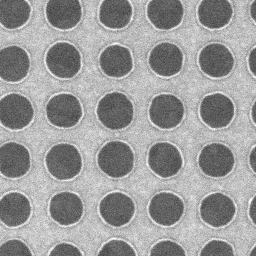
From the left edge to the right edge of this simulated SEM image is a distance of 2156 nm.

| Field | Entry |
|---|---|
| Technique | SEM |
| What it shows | a regular array of raised bodies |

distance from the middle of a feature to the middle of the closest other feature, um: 0.415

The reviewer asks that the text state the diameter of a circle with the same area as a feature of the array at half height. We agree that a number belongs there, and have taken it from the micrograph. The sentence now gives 314 nm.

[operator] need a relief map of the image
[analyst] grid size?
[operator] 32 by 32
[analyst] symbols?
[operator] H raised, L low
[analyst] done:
HHHHLLHHHHLLLHHHLLHHHHHLLHHHHLLH
HHHHLLHHHHLLHHHHHLHHHHHLLHHHHLLH
HHHHLLHHHHLLHHHHLLLHHHHLLHHHHLLL
LHLLLLLHHLLLLHHHLLLHHHLLLLHHLLLL
LLLLLLLLLLLLLLLLLLLLLLLLLLLLLLLL
LLLLLLLHHLLLLLHLLLLLHHLLLLHHLLLL
HHHLLLHHHHLLLHHHLLLHHHHLLHHHHLLH
HHHHLLHHHHLLHHHHHLHHHHHLLHHHHLLH
HHHHLLHHHHLLLHHHHLLHHHHLLHHHHLLH
HHHLLLLHHLLLLHHHLLLLHHLLLLHHLLLL
LLLLLLLLLLLLLLLLLLLLLLLLLLLLLLLL
LLLLLLLLLLLLLLHLLLLLLLLLLLLLLLLL
HHHHLLHHHHLLHHHHLLLHHHHLLHHHHLLL
HHHHLLHHHHLLHHHHHLLHHHHLLHHHHLLH
HHHHLLHHHHLLHHHHHLLHHHHLLHHHHLLH
HHHHLLHHHHLLLHHHLLLHHHLLLLHHHLLL
LLLLLLLLLLLLLLLLLLLLLLLLLLLLLLLL
LLLLLLLLLLLLLLLLLLLLLLLLLLLLLLLL
HHHLLLHHHHLLLHHHLLLHHHLLLHHHHLLL
HHHHLLHHHHLLHHHHHLHHHHHLLHHHHLLH
HHHHLLHHHHLLHHHHHLHHHHHLLHHHHLLH
HHHHLLHHHHLLLHHHLLLHHHLLLHHHHLLL
LLLLLLLHHLLLLLLLLLLLLLLLLLLLLLLL
LLLLLLLLLLLLLLLLLLLLLLLLLLLLLLLL
HHHLLLLHHHLLLHHHLLLHHHLLLLHHHLLL
HHHHLLHHHHLLHHHHHLLHHHHLLHHHHLLH
HHHHLLHHHHLLHHHHHLHHHHHLLHHHHHLH
HHHHLLLHHHLLLHHHLLLHHHHLLHHHHLLH
LLLLLLLLLLLLLLLLLLLLLLLLLLLHLLLL
LLLLLLLLLLLLLLLLLLLLLLLLLLLLLLLL
HHHLLLLHHLLLLHHHLLLHHHLLLLHHHLLL
HHHHLLHHHHLLHHHHHLLHHHHLLHHHHLLH